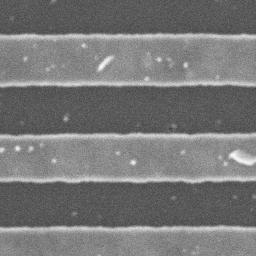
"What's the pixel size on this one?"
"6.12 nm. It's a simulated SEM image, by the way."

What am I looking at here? lines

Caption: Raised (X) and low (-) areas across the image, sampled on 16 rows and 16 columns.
----------------
----------------
XXXXXXXXXXXXXXXX
XXXXXXXXXXXXXXXX
XXXXXXXXXXXXXXXX
----------------
----------------
----------------
XXXXXXXXXXXXXXXX
XXXXXXXXXXXXXXXX
XXXXXXXXXXXXXXXX
----------------
----------------
----------------
XXXXXXXXXXXXXXXX
XXXXXXXXXXXXXXXX